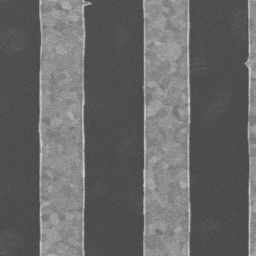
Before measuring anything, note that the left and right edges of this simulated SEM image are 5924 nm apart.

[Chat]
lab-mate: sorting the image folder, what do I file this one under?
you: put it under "one or a few lines or trenches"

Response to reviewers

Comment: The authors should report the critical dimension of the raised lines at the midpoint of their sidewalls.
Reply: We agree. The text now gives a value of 999 nm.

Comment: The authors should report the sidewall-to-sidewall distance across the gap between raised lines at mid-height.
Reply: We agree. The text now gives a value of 1420 nanometres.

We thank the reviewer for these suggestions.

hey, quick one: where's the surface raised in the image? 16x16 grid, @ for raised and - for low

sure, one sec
--@@@----@@@----
---@@----@@@----
---@@----@@@----
---@@----@@@----
---@@----@@@----
---@@----@@@----
---@@----@@@----
---@@----@@@----
---@@----@@@----
---@@----@@@----
---@@----@@@----
---@@----@@@----
---@@----@@@----
---@@----@@@----
---@@----@@@----
---@@----@@@----